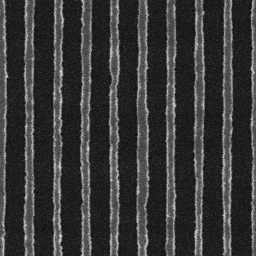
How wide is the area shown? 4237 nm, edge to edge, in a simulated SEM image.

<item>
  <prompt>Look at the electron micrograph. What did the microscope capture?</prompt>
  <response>parallel lines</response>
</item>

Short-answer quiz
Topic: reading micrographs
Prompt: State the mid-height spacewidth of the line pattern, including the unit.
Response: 0.335 micrometres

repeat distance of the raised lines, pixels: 28.3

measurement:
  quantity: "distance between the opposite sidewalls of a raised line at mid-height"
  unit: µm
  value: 0.128